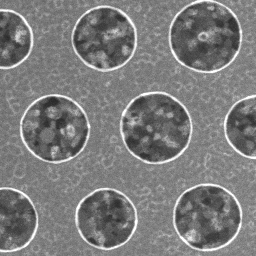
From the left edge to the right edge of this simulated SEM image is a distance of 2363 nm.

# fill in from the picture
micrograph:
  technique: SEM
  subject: raised bodies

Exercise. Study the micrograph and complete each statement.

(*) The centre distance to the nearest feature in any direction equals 935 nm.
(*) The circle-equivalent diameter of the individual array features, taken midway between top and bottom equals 619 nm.